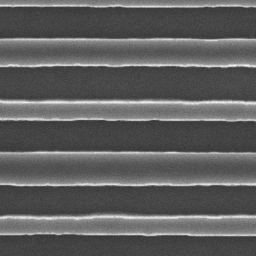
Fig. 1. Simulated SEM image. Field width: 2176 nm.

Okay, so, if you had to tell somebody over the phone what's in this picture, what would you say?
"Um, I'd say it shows lines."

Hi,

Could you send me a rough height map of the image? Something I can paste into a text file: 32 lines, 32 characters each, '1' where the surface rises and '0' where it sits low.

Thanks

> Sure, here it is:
11111111111111111111111111111111
00000000000000000000000000000000
00000000000000000000000000000000
00000000000000000000000000000000
00000000000000000000000000000000
11111111111111111111111111111111
11111111111111111111111111111111
11111111111111111111111111111111
00000000000000000000000000000000
00000000000000000000000000000000
00000000000000000000000000000000
00000000000000000000000000000000
00000000000000000000000000000000
11111111111111111111111111111111
11111111111111111111111111111111
00000000000000000000000000000000
00000000000000000000000000000000
00000000000000000000000000000000
00000000000000000000000000000000
11111111111111111111111111111111
11111111111111111111111111111111
11111111111111111111111111111111
11111111111111111111111111111111
00000000000000000000000000000000
00000000000000000000000000000000
00000000000000000000000000000000
00000000000000000000000000000000
11111111111111111111111111111111
11111111111111111111111111111111
00000000000000000000000000000000
00000000000000000000000000000000
00000000000000000000000000000000